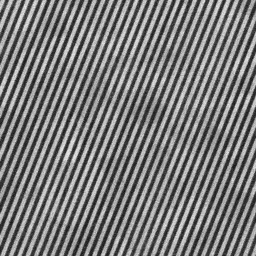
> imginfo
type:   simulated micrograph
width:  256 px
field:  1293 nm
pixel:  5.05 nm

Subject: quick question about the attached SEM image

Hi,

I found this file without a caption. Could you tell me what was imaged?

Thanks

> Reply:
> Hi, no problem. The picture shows parallel lines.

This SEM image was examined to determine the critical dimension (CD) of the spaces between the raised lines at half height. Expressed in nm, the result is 24.7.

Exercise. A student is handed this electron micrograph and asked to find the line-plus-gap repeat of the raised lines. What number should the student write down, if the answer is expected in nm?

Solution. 39.3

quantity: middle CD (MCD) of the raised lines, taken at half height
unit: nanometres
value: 14.7